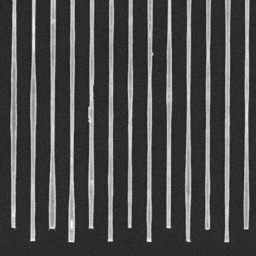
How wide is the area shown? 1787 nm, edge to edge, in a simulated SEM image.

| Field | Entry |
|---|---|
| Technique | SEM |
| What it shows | parallel lines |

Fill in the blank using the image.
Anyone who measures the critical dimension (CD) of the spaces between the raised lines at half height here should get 15.6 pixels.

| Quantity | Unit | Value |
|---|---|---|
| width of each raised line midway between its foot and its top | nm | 32.3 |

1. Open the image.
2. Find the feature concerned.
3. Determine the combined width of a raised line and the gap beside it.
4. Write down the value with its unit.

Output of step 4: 135 nm